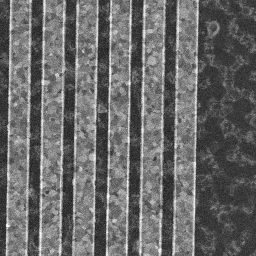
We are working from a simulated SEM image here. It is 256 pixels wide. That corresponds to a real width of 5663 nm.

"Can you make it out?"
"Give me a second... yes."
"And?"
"parallel lines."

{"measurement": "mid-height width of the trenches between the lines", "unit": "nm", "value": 318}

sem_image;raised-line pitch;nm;739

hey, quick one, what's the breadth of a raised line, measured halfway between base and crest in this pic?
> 0.426 um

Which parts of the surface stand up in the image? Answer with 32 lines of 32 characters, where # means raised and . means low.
.###..##..##..##..##..###.......
.###..##..##..##..##..###.......
.###..##..##..##..##..###.......
.###..##..##..##..##..###.#.....
.###..##..##..##..##..###.......
.###..##..##..##..##..###.......
.###..##..##..##..##..###.......
.###..##..##..##..##..###.......
.###..##..##..##..##..###.......
.###.###..##..##..##..###.......
.###.###..##..##..##..##........
.###.###..##..##..##..##........
.###.###..##..##..##..##........
.###.###..##..##..##..##........
.##..###..##..##..##..##........
.##..###..##..##..##..##........
.##..###..##..##..##..##........
.##..###..##..##..##..##........
.##..###..##..##..##..##........
.##..###..##..##..##..##........
.##..###..##..##..##..##........
.##..###.###..##..##..##........
.##..###.###..##..##..##........
.##..###.###..##..##..##........
.##..###.###..##..##..##........
.##..###.###..##..##..##........
.##..##..###.###..##..##........
.##..##..###.###..##..##........
.##..##..###.###..##..##........
.##..##..###.###..##..##........
.##..##..###.###.###..##........
.##..##..###.###..##..##........